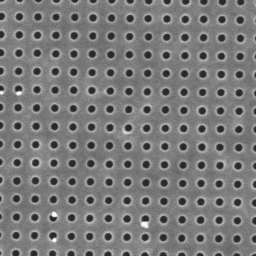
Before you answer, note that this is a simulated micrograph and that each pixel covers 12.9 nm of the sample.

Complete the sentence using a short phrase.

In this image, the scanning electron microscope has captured a regular array of holes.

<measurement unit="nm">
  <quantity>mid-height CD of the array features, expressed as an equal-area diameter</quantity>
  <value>97.9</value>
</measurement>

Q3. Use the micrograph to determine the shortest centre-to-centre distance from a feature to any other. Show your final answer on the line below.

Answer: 232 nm